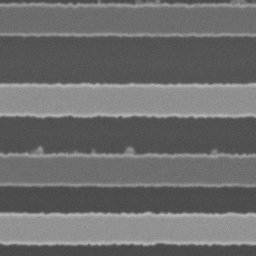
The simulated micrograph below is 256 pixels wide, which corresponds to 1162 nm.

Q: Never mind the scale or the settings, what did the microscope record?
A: lines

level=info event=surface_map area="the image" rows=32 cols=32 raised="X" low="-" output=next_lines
XXXXXXXXXXXXXXXX--X-XXX-XXXXXX-X
XXXXXXXXXXXXXXXXXXXXXXXXXXXXXXXX
XXXXXXXXXXXXXXXXXXXXXXXXXXXXXXXX
XXXXXXXXXXXXXXXXXXXXXXXXXXXXXXXX
--XXX----X-----XXXXXXXXXXXXX-XXX
--------------------------------
--------------------------------
--------------------------------
--------------------------------
--------------------------------
XXXXXX----X-X---X--X----X----X-X
XXXXXXXXXXXXXXXXXXXXXXXXXXXXXXXX
XXXXXXXXXXXXXXXXXXXXXXXXXXXXXXXX
XXXXXXXXXXXXXXXXXXXXXXXXXXXXXXXX
XXXXXXXX-XXXXXXXXXXXXXXXXXXXXXXX
--------------------------------
--------------------------------
--------------------------------
--------------------------------
XXXXXXXXXXXXXXXXXXXXXXXXXXXXXXXX
XXXXXXXXXXXXXXXXXXXXXXXXXXXXXXXX
XXXXXXXXXXXXXXXXXXXXXXXXXXXXXXXX
XXXXXXXXXXXXXXXXXXXXXXXXXXXXXXXX
--------------------------------
--------------------------------
--------------------------------
--------------------------------
XXXXXXXXXXXXXXXXXXXXXXXXXXXXXXXX
XXXXXXXXXXXXXXXXXXXXXXXXXXXXXXXX
XXXXXXXXXXXXXXXXXXXXXXXXXXXXXXXX
XXXXXXXXXXXXXXX--XX---XXXXXXXX-X
--------------------------------